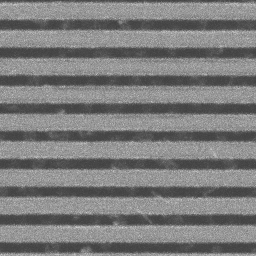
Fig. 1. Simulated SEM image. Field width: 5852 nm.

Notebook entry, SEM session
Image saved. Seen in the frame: parallel lines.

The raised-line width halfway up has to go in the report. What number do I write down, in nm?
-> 317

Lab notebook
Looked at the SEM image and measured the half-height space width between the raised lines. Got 320 nm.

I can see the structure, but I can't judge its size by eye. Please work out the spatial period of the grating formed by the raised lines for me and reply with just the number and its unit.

0.637 µm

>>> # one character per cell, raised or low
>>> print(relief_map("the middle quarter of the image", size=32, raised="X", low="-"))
--------------------------------
--------------------------------
----XXXXXXXXXXXXX---------------
XXXXXXXXXXXXXXXXXXXXXXXXXXXXXXXX
XXXXXXXXXXXXXXXXXXXXXXXXXXXXXXXX
XXXXXXXXXXXXXXXXXXXXXXXXXXXXXXXX
--------------------------------
--------------------------------
--------------------------------
----------X------XXXXXXXXXXXXXXX
XXXXXXXXXXXXXXXXXXXXXXXXXXXXXXXX
XXXXXXXXXXXXXXXXXXXXXXXXXXXXXXXX
XXXXXXXXXXXXXXXXXXXXXXXXXXXXXXXX
--------------------------------
--------------------------------
--------------------------------
XXXXXXXXXXXXXXXXXXXXXXXXXXXXXXXX
XXXXXXXXXXXXXXXXXXXXXXXXXXXXXXXX
XXXXXXXXXXXXXXXXXXX---XXXXXXXXXX
XXXXXXXXXXXXXXXXXXXXXXXXXXXXXXXX
--------------------------------
--------------------------------
--------------------------------
XXXXXXXXXXXXXXXXXXXXXXXXXXXXXXXX
XXXXXXXXXXXXXXXXXXXXXXXXXXXXXXXX
XXXXXXXXXXXXXXXXXXXXXXXXXXXXXXXX
XXXXXXXXXXXXXXXXXXXXXXXXXXXXXXXX
--------------------------------
--------------------------------
--------------------------------
XXXXXXXXXXXXXXXXXXXXXXXXXXXXXXXX
XXXXXXXXXXXXXXXXXXXXXXXXXXXXXXXX